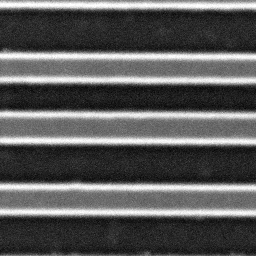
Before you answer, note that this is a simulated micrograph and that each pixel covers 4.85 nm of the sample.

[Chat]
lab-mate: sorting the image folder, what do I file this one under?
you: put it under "one or a few lines or trenches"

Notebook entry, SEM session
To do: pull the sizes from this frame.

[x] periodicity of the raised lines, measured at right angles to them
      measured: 319 nm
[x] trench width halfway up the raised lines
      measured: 224 nm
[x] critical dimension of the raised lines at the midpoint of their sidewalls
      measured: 122 nm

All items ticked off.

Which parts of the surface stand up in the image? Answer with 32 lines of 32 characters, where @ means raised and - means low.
@@@@@@@@@@@@@@@@@@@@@@@@@@@@@@@@
--------------------------------
--------------------------------
--------------------------------
--------------------------------
--------------------------------
--------------------------------
@@@@@@@@@@@@@@@@@@@@@@@@@@@@@@@@
@@@@@@@@@@@@@@@@@@@@@@@@@@@@@@@@
@@@@@@@@@@@@@@@@@@@@@@@@@@@@@@@@
--------------------------------
--------------------------------
--------------------------------
--------------------------------
@@@@@@@@@@@@@@@@@@@@@@@@@@@-----
@@@@@@@@@@@@@@@@@@@@@@@@@@@@@@@@
@@@@@@@@@@@@@@@@@@@@@@@@@@@@@@@@
@@@@@@@@@@@@@@@@@@@@@@@@@@@@@@@@
--------------------------------
--------------------------------
--------------------------------
--------------------------------
--------------------------------
@@@@@@@@@@@@@@@@@@@-------------
@@@@@@@@@@@@@@@@@@@@@@@@@@@@@@@@
@@@@@@@@@@@@@@@@@@@@@@@@@@@@@@@@
-----------@@@@@@@@@@@@@@@@@@@@@
--------------------------------
--------------------------------
--------------------------------
--------------------------------
--------------------------------